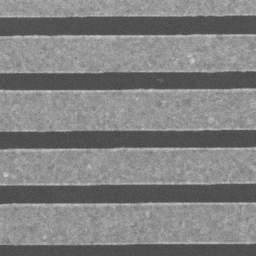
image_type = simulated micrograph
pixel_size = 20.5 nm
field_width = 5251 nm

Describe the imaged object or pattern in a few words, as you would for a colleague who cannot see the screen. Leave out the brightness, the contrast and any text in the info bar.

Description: lines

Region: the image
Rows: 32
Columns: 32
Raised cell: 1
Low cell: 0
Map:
11111111111111111111111111111111
11111111111111111111111111111111
00000000000000000000000000000000
00000000000000000000000000000000
00001001111111111111111111111111
11111111111111111111111111111111
11111111111111111111111111111111
11111111111111111111111111111111
11111111111111111111111111111111
00000000000000000000000000000000
00000000000000000000000000000000
11111111111111111111111111111111
11111111111111111111111111111111
11111111111111111111111111111111
11111111111111111111111111111111
11111111111111111111111111111111
00000000000000000000000000000000
00000000000000000000000000000000
00000000000000000000000000000000
11111111111111111111111111111111
11111111111111111111111111111111
11111111111111111111111111111111
11111111111111111111111111111111
00000000000000000000000000000000
00000000000000000000000000000000
00000000000000000001111111111111
11111111111111111111111111111111
11111111111111111111111111111111
11111111111111111111111111111111
11111111111111111111111111111111
11111111111111100000000000000000
00000000000000000000000000000000